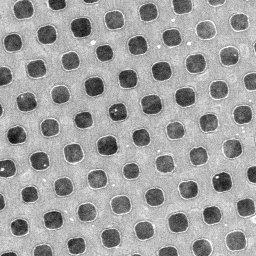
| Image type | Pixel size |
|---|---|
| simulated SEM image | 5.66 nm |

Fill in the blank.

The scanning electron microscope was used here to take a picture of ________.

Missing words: a regular array of raised bodies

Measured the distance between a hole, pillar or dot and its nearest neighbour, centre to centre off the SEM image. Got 196 nanometres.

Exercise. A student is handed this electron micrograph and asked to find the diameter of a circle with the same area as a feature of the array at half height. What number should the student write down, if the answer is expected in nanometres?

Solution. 115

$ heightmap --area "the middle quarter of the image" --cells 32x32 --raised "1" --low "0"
11110000000000000000001111100011
11000000000000011000001111100001
00000000000000111100001111100000
00000011101000111100001111000000
00000111110000111100000000000000
00000111110000111100000000000000
10000111110000000100000000001111
11000011100000000100000000001111
10000000000000000000111100001111
10000000000000000001111100001111
00000000000011100001111110000111
00000000000111110000111100000000
00011110000111110000011000000000
10011110000111100000000000000000
10111110000000010000000000011000
00011110000000000000000000111110
00000000000000000011100000111110
00000000000000000111100000111100
00000000011110000111110000111100
00000000111110000111110000000000
11110000111110000011000000000000
11111000111110000000000000000000
11111000011110000000000000000001
11111000000000000000000111100001
01110000000000000000000111100000
00000000000000011110000111110000
00000000100000011110000111100000
00000011111000011110000000000000
10000011111000011100000000000000
11000011111000000000000000000111
11000011110000000000000000000111
11000000000000000000011100000111